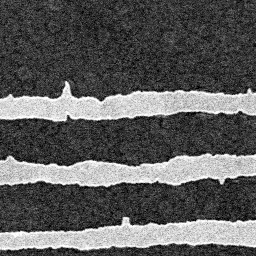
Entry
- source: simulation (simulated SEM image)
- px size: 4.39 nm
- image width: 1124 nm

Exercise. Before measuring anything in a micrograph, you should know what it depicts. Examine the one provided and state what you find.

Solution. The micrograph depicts one or a few lines or trenches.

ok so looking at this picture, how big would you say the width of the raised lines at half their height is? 87.8 nm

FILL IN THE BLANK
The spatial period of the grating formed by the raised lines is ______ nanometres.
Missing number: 288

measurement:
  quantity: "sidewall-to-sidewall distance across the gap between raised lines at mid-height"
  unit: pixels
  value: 45